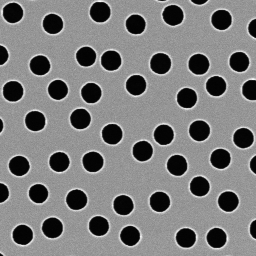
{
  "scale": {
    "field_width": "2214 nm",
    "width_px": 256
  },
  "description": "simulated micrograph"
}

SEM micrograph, a regular array of holes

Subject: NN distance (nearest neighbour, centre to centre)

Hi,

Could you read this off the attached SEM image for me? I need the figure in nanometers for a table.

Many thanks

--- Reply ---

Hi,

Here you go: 275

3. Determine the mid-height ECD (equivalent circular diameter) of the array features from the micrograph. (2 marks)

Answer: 177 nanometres